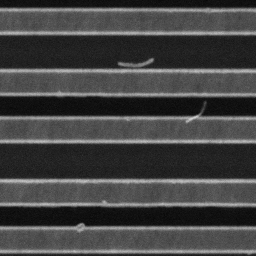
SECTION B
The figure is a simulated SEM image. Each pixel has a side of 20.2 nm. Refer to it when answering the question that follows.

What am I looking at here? lines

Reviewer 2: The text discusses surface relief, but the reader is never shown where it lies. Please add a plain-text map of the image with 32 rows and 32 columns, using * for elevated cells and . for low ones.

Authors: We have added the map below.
................................
********************************
********************************
********************************
................................
................................
................................
................................
................................
********************************
********************************
********************************
................................
................................
................................
********************************
********************************
********************************
................................
................................
................................
................................
*........*......................
********************************
********************************
********************************
................................
................................
********************************
********************************
********************************
*.******************************